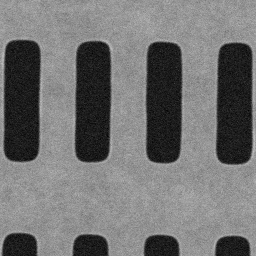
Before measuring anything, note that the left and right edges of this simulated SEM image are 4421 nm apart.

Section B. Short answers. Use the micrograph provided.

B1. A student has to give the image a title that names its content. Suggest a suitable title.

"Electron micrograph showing groups of lines, slits or small figures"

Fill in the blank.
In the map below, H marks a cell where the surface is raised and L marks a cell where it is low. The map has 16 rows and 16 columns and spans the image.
HHHHHHHHHHHHHHHH
HHHHHHHHHHHHHHHH
HLHHHHHHHHHHHHHH
LLLHHLLHHLLHHHLL
LLLHHLLHHLLHHHLL
LLLHHLLHHLLHHHLL
LLLHHLLHHLLHHLLL
LLLHHLLHHLLHHLLL
LLLHHLLHHLLHHLLL
LLHHHLLHHLLHHHLL
HHHHHHHHHHHHHHHH
HHHHHHHHHHHHHHHH
HHHHHHHHHHHHHHHH
HHHHHHHHHHHHHHHH
HHHHHHHHHHHHHHHH
LLHHHLLHHLLHHLLL